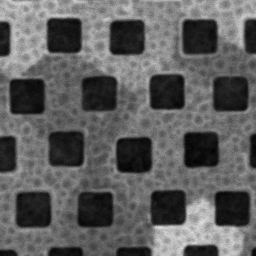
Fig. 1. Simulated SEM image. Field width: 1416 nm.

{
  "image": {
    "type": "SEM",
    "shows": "a regular array of holes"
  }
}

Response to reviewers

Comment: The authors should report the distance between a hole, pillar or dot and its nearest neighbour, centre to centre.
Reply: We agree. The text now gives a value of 0.348 microns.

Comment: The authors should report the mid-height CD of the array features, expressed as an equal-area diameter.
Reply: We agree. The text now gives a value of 220 nanometers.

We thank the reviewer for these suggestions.